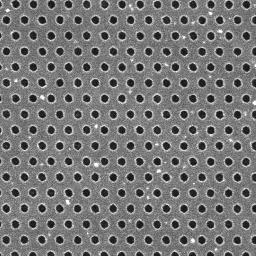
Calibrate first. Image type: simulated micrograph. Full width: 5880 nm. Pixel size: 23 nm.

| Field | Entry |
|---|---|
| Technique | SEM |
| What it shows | a regular array of holes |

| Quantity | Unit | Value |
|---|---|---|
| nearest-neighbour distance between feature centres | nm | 401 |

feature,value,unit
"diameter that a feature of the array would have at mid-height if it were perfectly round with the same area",187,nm